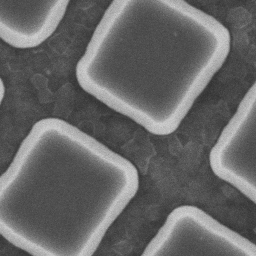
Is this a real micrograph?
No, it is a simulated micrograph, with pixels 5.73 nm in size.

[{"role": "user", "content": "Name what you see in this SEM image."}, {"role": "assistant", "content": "raised bodies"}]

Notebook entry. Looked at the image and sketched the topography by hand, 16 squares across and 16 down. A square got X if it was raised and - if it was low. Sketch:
XXXX---XXXXX----
XXX----XXXXXX---
-X----XXXXXXXX--
-----XXXXXXXXX--
-----XXXXXXXX---
------XXXXXX----
-------XXXXX---X
---------XX----X
--XXX---------XX
-XXXXXX-------XX
-XXXXXXX------XX
XXXXXXXX-------X
XXXXXXXX--------
XXXXXXX----X----
XXXXXX----XXXX--
--XXXX----XXXXXX